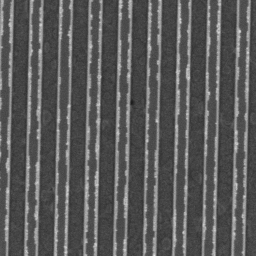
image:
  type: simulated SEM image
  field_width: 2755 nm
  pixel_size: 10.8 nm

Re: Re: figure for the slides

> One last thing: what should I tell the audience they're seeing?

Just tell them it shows parallel lines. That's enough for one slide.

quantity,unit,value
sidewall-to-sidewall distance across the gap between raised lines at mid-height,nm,195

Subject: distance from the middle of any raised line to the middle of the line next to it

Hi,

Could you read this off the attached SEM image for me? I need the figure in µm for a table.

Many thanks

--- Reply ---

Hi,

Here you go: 0.319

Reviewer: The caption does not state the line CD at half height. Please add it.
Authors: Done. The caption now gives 0.13 microns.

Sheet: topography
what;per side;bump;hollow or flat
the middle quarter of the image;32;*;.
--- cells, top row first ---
*.....***.....**.....***.....**.
*.....***.....**.....***....***.
*.....***.....**.....***....***.
*.....***.....**.....***....***.
*.....***.....**.....***....***.
*.....***.....**.....***....***.
*.....***....***.....***....***.
*.....***....***.....***....***.
*.....***....***.....***....***.
*.....***....***.....***....***.
*.....***....***.....***....***.
*.....***....***.....***....***.
*.....***....***.....**.....***.
*.....***....***.....**.....***.
*.....***....***.....**.....***.
*.....***....***.....**.....***.
*.....***....***.....**.....***.
*.....***....***.....**.....***.
*.....***....***.....**.....***.
*.....***....***.....**.....***.
*.....***....***.....**.....***.
*.....***....***.....**.....***.
*.....**.....***....***.....***.
*.....**.....***....***.....***.
*.....**.....***.....**.....***.
*.....**.....***.....**.....***.
*.....**.....***....***.....***.
*.....**.....***....***.....***.
*.....**.....***.....**.....**..
*.....**.....***.....**.....**..
*.....**.....***.....**.....***.
*.....**.....***....***.....***.